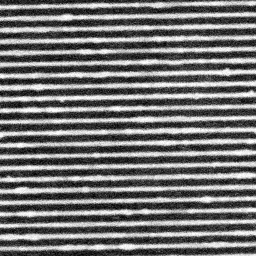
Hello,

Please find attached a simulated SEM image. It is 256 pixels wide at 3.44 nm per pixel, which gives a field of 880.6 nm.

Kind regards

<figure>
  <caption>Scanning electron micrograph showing parallel lines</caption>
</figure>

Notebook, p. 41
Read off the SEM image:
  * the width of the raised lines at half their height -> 2.88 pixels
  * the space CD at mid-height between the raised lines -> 8.37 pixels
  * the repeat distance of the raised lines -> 39.6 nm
